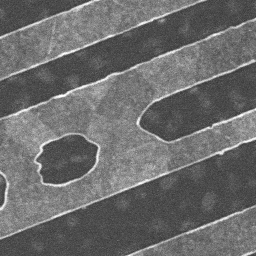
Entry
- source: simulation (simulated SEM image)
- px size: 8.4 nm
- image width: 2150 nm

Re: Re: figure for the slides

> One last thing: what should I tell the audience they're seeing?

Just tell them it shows one or a few lines or trenches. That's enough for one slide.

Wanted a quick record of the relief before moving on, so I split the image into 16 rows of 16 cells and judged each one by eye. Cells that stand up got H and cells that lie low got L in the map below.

LLLLLHHHHHHLLLLL
LLHHHHHHHLLLLLLH
HHHHHHLLLLLLLHHH
HHHHLLLLLLHHHHHH
HLLLLLLLHHHHHHLL
LLLLLHHHHHHHLLLL
LLHHHHHHHHLLLLLL
HHHHHHHHHLLLLLHH
HHHHLHHHHHLLHHHH
HHHLLLHHHHHHHHLL
HHLLLLHHHHHLLLLL
HHHLHHHHHLLLLLLL
HHHHHHLLLLLLLLLL
HHHHLLLLLLLLLLHH
HLLLLLLLLLLLHHHH
LLLLLLLLLHHHHHHH